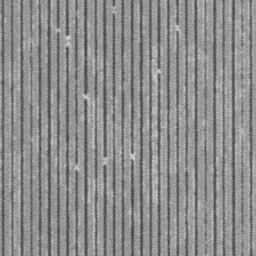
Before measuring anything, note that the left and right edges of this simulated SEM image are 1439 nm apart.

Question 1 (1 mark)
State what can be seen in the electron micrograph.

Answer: parallel lines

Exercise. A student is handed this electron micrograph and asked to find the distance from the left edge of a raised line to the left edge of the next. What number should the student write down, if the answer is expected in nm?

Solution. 51.6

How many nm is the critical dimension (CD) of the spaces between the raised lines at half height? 16.9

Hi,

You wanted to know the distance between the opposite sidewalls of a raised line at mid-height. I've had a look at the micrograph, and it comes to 38.7 nm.